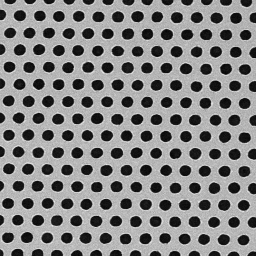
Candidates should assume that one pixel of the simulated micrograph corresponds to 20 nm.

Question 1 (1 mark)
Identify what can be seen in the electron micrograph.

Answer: a regular array of holes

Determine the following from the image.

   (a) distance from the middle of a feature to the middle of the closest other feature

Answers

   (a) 384 nm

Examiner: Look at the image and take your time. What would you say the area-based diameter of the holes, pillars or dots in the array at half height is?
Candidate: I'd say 0.233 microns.